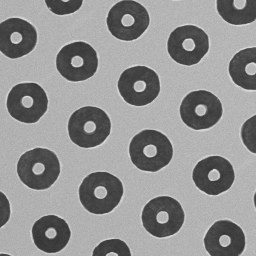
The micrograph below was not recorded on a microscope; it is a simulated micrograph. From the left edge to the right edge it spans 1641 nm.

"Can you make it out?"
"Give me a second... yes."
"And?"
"a regular array of ring-shaped grooves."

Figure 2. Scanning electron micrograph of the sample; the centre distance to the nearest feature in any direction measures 414 nm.